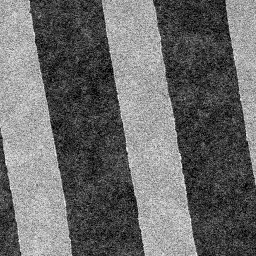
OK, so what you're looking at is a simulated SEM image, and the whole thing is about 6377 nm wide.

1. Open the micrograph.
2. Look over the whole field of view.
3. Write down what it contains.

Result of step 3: one or a few lines or trenches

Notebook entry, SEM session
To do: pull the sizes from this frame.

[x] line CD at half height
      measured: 1250 nanometres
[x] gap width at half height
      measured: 1.78 µm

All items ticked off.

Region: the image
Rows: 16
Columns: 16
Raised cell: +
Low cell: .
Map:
++....++++....++
++.....+++....++
++.....+++....++
++.....+++.....+
+++....+++.....+
+++....+++.....+
+++....++++....+
+++.....+++....+
+++.....+++....+
+++.....+++.....
++++....+++.....
.+++....++++....
.+++.....+++....
.+++.....+++....
.+++.....+++....
.+++.....+++....